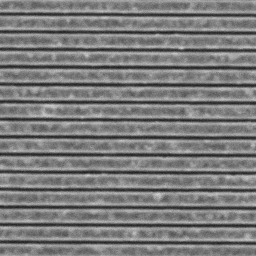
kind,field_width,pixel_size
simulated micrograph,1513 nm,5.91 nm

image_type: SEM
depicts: parallel lines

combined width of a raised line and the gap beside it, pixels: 17.5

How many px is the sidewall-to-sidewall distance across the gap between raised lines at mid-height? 4.25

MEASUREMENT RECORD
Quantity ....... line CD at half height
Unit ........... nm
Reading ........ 76.9